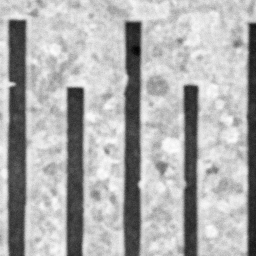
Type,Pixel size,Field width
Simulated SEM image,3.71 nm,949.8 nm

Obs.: parallel lines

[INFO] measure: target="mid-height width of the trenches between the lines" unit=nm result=73.4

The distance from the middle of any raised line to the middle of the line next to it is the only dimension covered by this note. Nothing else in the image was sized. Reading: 219 nm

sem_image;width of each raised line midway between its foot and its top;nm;144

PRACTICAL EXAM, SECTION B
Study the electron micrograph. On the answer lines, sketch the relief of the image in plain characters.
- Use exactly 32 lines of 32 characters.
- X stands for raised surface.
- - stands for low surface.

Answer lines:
XXXXXXXXXXXXXXXXXXXXXXXXXXXXXXXX
XXXXXXXXXXXXXXXXXXXXXXXXXXXXXXXX
X--XXXXXXXXXXXXX--XXXXXXXXXXXXXX
X---XXXXXXXXXXX---XXXXXXXXXXXXX-
X---XXXXXXXXXXX---XXXXXXXXXXXXX-
X---XXXXXXXXXXX---XXXXXXXXXXXXX-
X---XXXXXXXXXXX---XXXXXXXXXXXXX-
X---XXXXXXXXXXX---XXXXXXXXXXXXX-
X---XXXXXXXXXXXX--XXXXXXXXXXXXX-
X---XXXXXXXXXXXX--XXXXXXXXXXXXX-
X---XXXXXXXXXXXX--XXXXX--XXXXXX-
X---XXXX---XXXX---XXXXX--XXXXXX-
X---XXXX---XXXX---XXXXX--XXXXXX-
X---XXXX---XXXX---XXXXX--XXXXXX-
X---XXXX---XXXX---XXXXX--XXXXXX-
X---XXXX---XXXX---XXXXX--XXXXXX-
X---XXXX---XXXX---XXXXX--XXXXXX-
X---XXXX---XXXX---XXXXX--XXXXXX-
X---XXXX---XXXX---XXXXX--XXXXXX-
X---XXXX---XXXX---XXXXX--XXXXXX-
X---XXXX---XXXX---XXXXX--XXXXXX-
X---XXXX---XXXX---XXXXX--XXXXXX-
X---XXXX---XXXX---XXXXX--XXXXXX-
X---XXXX---XXXX---XXXXX--XXXXXX-
X---XXXX---XXXX---XXXXX--XXXXXX-
X---XXXX---XXXX---XXXXX--XXXXXX-
X---XXXX---XXXX---XXXXX--XXXXXX-
X--XXXXX---XXXX---XXXXX--XXXXXX-
X--XXXXX---XXXX---XXXXX--XXXXXX-
X--XXXXX---XXXX---XXXXX--XXXXXX-
X--XXXXX---XXXX---XXXXX--XXXXXX-
X--XXXXX---XXXX---XXXXX--XXXXXX-